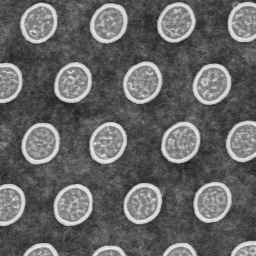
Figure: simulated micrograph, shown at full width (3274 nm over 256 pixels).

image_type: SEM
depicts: a regular array of raised bodies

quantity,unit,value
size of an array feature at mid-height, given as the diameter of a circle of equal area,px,36.5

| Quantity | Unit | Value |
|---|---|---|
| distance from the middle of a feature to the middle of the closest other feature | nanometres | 863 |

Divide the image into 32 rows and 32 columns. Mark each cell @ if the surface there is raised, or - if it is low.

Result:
------------------------------@@
---@@@@-----@@@------@@@-----@@@
---@@@@-----@@@@----@@@@-----@@@
---@@@@----@@@@@----@@@@-----@@@
---@@@------@@@-----@@@------@@@
--------------------------------
--------------------------------
--------------------------------
@@------@@@------@@-------@@----
@@-----@@@@-----@@@@-----@@@@---
@@@----@@@@-----@@@@----@@@@@---
@@-----@@@@-----@@@@----@@@@----
@-------@@-------@-------@@-----
--------------------------------
--------------------------------
-------------@--------@@------@@
----@@@-----@@@------@@@@----@@@
---@@@@----@@@@@----@@@@@----@@@
---@@@@----@@@@-----@@@@@----@@@
---@@@@-----@@@------@@@-----@@@
--------------------------------
--------------------------------
--------------------------------
@@------@@-------@@------@@@----
@@@----@@@@-----@@@@-----@@@@---
@@@----@@@@-----@@@@----@@@@@---
@@@----@@@@-----@@@@-----@@@----
@@------@@-------@@-------@-----
--------------------------------
--------------------------------
-------------------------------@
---@@@@-----@@@------@@@-----@@@